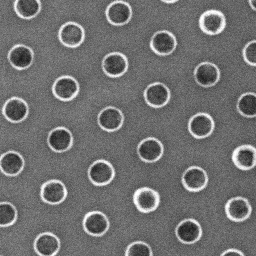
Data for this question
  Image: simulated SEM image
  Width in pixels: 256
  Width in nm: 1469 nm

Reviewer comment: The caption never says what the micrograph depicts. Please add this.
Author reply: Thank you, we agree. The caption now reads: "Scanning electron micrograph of a regular array of raised bodies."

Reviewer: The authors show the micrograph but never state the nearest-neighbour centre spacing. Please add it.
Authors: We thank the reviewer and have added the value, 297 nanometers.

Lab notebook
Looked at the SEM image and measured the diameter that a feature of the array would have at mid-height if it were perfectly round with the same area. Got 136 nm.